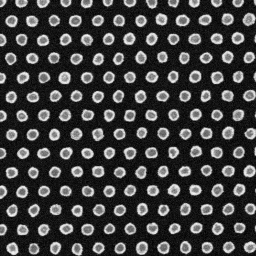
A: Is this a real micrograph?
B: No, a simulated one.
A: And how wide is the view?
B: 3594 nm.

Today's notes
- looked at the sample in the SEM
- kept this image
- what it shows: a regular array of raised bodies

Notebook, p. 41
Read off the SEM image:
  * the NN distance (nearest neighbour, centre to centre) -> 295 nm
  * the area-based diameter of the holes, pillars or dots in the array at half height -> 0.142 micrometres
